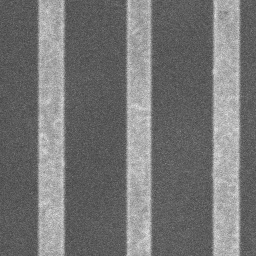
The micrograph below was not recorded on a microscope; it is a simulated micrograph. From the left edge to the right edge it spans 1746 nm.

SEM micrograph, one or a few lines or trenches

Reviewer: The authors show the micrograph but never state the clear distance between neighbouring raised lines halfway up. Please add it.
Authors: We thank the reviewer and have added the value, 0.439 µm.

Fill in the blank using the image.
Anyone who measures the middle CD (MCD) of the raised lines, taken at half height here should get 0.153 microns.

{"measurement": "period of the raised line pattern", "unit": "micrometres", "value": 0.598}